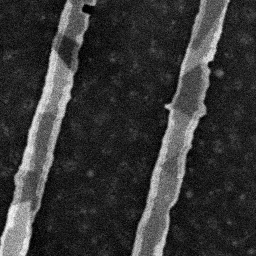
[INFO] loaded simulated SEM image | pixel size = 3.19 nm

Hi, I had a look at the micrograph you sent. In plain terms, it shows one or a few lines or trenches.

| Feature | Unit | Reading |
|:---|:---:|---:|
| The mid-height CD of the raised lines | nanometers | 80.5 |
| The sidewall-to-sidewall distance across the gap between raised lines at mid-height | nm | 333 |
